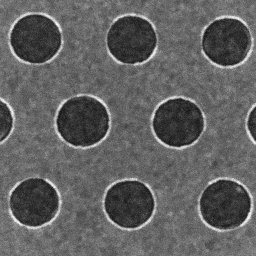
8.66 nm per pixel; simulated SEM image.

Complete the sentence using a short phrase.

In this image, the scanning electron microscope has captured a regular array of holes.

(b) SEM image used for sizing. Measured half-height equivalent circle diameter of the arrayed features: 426 nm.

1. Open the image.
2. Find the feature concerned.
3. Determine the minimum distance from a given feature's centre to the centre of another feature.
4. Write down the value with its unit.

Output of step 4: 818 nanometers